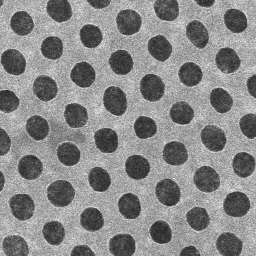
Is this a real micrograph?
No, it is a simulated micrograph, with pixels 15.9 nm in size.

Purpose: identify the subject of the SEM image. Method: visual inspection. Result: a regular array of holes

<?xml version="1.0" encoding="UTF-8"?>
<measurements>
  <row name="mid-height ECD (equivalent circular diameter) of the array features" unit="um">0.395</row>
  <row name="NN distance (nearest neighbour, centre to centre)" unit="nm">629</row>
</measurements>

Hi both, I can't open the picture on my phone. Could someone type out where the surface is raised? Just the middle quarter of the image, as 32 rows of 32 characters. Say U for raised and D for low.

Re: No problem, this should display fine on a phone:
UUUDDDDUUUUDDDDDDUUUUUUUUUUUUDDD
UUDDDDDDUUUUDDDDDUUUUUUUUUUUUDDD
UUDDDDDDUUUUUDDDUUUUUDDUUUUUDDDD
UUDDDDDDUUUUUUUUUUUUDDDDUUUUUDDD
UUDDDDDUUUUUUUUUUUUDDDDDDUUUUDDD
UUUDDDDUUUUUUUUUUUUDDDDDDUUUUUUD
UUUUUUUUUUDDDDDUUUUDDDDDDUUUUUUU
UUUUUUUUUUDDDDDUUUUDDDDDDUUUUUUU
UUUUUUUUUUDDDDDDUUUUDDDDUUUUUUUU
UUUUUUUUUUDDDDDDUUUUUUDUUUUUUDUU
UDDDDUUUUUDDDDDDUUUUUUUUUUUDDDDD
DDDDDDUUUUUDDDDDUUUUUUUUUUUDDDDD
DDDDDDUUUUUUDDDUUUUUUUUUUUDDDDDD
DDDDDDUUUUUUUUUUUUDDDDUUUUUDDDDD
DDDDDDUUUUUUUUUUUUDDDDDUUUUDDDDD
UDDDDUUUUUUUUUUUUDDDDDDUUUUUUUUU
UUUUUUUUDDDDUUUUUUDDDDDUUUUUUUUU
UUUUUUUUDDDDDUUUUUDDDDDUUUUUUUUU
UUUUUUUDDDDDDUUUUUUDDUUUUUUUUUUU
UUUUUUUUDDDDDDUUUUUUUUUUUUUDDUUU
DDDUUUUUDDDDDUUUUUUUUUUUUDDDDDUU
DDDDUUUUUDDDDUUUUUUUUUUUUDDDDDDU
DDDDUUUUUUUUUUUUUUUUUUUUUDDDDDDU
DDDDUUUUUUUUUUUUDDDDUUUUUDDDDDDU
DDDDUUUUUUUUUUUDDDDDDUUUUDDDDDUU
UDUUUUUUUUUUUUUDDDDDDUUUUUUUUUUU
UUUUUUUDDDUUUUUDDDDDDDUUUUUUUUUU
UUUUUUDDDDDUUUUUDDDDDUUUUUUUUUUU
UUUUUUDDDDDDUUUUUDDDUUUUUUUUUUUU
DUUUUUDDDDDDUUUUUUUUUUUUDDDDUUUU
DDUUUUUDDDDUUUUUUUUUUUUDDDDDDUUU
DDDUUUUDDDDUUUUUUUUUUUUDDDDDDUUU